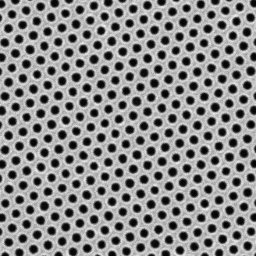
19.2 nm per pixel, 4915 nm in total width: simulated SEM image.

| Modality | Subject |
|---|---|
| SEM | a regular array of holes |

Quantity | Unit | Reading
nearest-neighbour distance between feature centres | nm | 279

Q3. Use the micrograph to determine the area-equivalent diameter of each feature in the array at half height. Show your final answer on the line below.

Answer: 0.184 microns